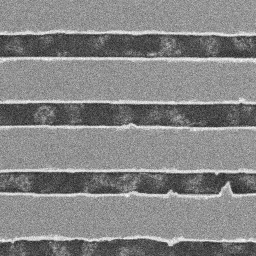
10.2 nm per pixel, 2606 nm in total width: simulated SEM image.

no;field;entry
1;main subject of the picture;one or a few lines or trenches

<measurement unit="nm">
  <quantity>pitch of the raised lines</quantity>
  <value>694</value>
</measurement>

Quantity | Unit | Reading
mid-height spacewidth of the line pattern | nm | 251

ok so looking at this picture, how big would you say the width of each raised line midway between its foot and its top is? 450 nanometres